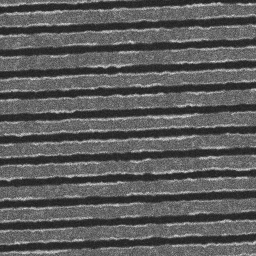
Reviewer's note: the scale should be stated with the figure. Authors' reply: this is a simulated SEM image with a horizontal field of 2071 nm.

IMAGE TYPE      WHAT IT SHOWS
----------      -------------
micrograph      parallel lines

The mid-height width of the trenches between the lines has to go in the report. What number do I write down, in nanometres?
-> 55.6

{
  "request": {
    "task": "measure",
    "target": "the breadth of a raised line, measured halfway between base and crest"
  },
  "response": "0.118 micrometres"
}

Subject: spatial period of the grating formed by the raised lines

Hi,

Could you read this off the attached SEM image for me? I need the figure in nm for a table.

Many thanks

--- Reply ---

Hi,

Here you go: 176